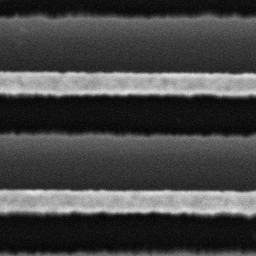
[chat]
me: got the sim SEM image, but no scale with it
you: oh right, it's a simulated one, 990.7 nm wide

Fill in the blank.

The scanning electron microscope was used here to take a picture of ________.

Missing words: lines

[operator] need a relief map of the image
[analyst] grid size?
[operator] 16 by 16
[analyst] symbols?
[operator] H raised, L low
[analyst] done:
LLLLLLLLLLLLLLLL
HHHHHHHHHHHHHHHH
HHHHHHHHHHHHHHHH
HHHHHHHHHHHHHHHH
HHHHHHHHHHHHHHHH
HHHHHHHHHHHHHHHH
LLLLLLLLLLLLLLLL
LLLLLLLLLLLLLLLL
HHHHLHHLLLLLLLLL
HHHHHHHHHHHHHHHH
HHHHHHHHHHHHHHHH
HHHHHHHHHHHHHHHH
HHHHHHHHHHHHHHHH
LLLLLLLLLLLLLLLL
LLLLLLLLLLLLLLLL
LLLLLLLLLLLLLLLL